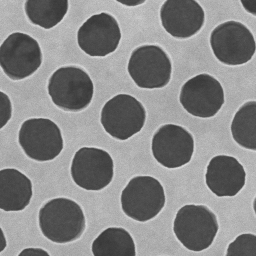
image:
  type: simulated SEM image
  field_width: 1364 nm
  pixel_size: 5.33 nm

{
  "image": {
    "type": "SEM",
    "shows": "a regular array of holes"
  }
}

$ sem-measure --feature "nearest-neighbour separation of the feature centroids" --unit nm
314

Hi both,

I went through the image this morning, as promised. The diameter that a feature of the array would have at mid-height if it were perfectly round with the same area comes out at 228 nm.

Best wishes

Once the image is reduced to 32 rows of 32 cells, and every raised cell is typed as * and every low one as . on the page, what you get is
***.....*******..****....*****..
***.....************.....******.
****....***...******.....*******
**********.....******....**....*
*...******.....*******..**......
.....*****.....***********......
.....******...***...*******.....
.....***********.....******....*
.....***.*******.....***********
*..****....*****.....****.******
******......*****....**.....****
******......***********.....****
.******....***...******.....****
.*******..***.....*****....***..
.************.....******..***...
.**....******.....***********...
**.....******....***...******...
**......***********.....*****...
***.....**.********.....*******.
****...**.....*****.....***.****
*********.....******...***....**
..*******.....************.....*
....*****.....***...******.....*
....******...***....******....**
....***********......***********
....**....*****......***********
*****.....******....**....******
*****.....*******.****.....*****
*****.....************.....*****
******....**....******.....***..
.***********.....******...***...
***...******.....***********....